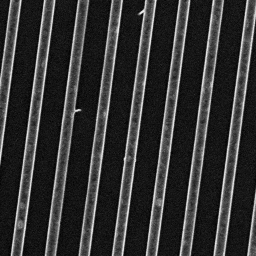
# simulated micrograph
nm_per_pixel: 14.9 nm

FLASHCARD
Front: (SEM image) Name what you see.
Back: parallel lines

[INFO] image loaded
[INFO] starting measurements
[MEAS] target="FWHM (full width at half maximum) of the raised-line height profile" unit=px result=10.4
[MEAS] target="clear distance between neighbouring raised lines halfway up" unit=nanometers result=353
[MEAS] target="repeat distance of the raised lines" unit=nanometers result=499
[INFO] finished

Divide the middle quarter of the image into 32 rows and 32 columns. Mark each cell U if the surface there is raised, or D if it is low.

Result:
DDUUDDDDDDUUDDDDDDUUUDDDDDDUUDDD
DUUUDDDDDDUUDDDDDDUUUDDDDDDUUDDD
DUUUDDDDDDUUDDDDDDUUDDDDDDDUUDDD
DUUUDDDDDDUUDDDDDDUUDDDDDDUUUDDD
DUUDDDDDDUUUDDDDDDUUDDDDDDUUUDDD
DUUDDDDDDUUUDDDDDDUUDDDDDDUUDDDD
DUUDDDDDDUUUDDDDDUUUDDDDDDUUDDDD
DUUDDDDDDUUDDDDDDUUUDDDDDDUUDDDD
DUUDDDDDDUUDDDDDDUUUDDDDDDUUDDDD
UUUDDDDDDUUDDDDDDUUUDDDDDDUUDDDD
UUUDDDDDDUUDDDDDDUUDDDDDDDUUDDDD
UUUDDDDDUUUDDDDDDUUDDDDDDUUUDDDD
UUDDDDDDUUUDDDDDDUUDDDDDDUUUDDDD
UUDDDDDDUUUDDDDDDUUDDDDDDUUDDDDD
UUDDDDDDUUUDDDDDUUUDDDDDDUUDDDDD
UUDDDDDDUUDDDDDDUUUDDDDDDUUDDDDD
UUDDDDDDUUDDDDDDUUUDDDDDDUUDDDDD
UUDDDDDDUUDDDDDDUUUDDDDDDUUDDDDD
UUDDDDDDUUDDDDDDUUDDDDDDDUUDDDDD
UUDDDDDUUUDDDDDDUUDDDDDDUUUDDDDD
UDDDDDDUUUDDDDDDUUDDDDDDUUUDDDDD
UDDDDDDUUUDDDDDDUUDDDDDDUUUDDDDD
UDDDDDDUUUDDDDDUUUDDDDDDUUDDDDDD
UDDDDDDUUDDDDDDUUUDDDDDDUUDDDDDD
UDDDDDDUUDDDDDDUUUDDDDDDUUDDDDDD
UDDDDDDUUDDDDDDUUDDDDDDDUUDDDDDD
UDDDDDDUUDDDDDDUUDDDDDDUUUDDDDDD
UDDDDDUUUDDDDDDUUDDDDDDUUUDDDDDD
DDDDDDUUUDDDDDDUUDDDDDDUUDDDDDDD
DDDDDDUUUDDDDDUUUDDDDDDUUDDDDDDU
DDDDDDUUDDDDDDUUUDDDDDDUUDDDDDDU
DDDDDDUUDDDDDDUUUDDDDDDUUDDDDDDU